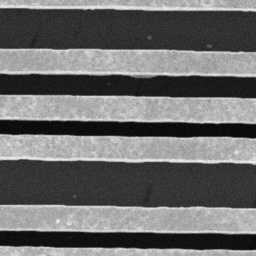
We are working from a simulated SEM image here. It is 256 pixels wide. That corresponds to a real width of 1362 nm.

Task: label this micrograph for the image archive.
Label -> lines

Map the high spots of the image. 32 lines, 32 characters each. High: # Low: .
################################
................................
................................
................................
................................
................................
#########################.......
################################
################################
..............................##
................................
................................
################################
################################
################################
................................
................................
################################
################################
################################
................................
................................
................................
................................
................................
................................
################################
################################
################################
................................
................................
################################